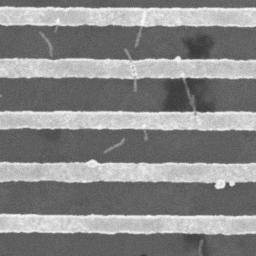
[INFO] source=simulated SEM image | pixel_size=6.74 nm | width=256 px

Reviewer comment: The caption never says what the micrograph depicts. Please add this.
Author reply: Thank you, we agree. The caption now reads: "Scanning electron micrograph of lines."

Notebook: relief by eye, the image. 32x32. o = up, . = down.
................................
oooooooooooooooooooooooooooooooo
oooooooooooooooooooooooooooooooo
................................
................................
................................
................................
oooooo.ooooo.o..o.ooooo....oo...
oooooooooooooooooooooooooooooooo
oooooooooooooooooooooooooooooooo
................................
................................
................................
................................
oooooooooooooooooooooooooooooooo
oooooooooooooooooooooooooooooooo
................................
................................
................................
................................
ooooooooooooooooooo.oooooo.....o
oooooooooooooooooooooooooooooooo
ooooo..ooooooooooooooooooooooooo
................................
................................
................................
................................
oooooooooooooooooooooooooooooooo
oooooooooooooooooooooooooooooooo
................................
................................
................................